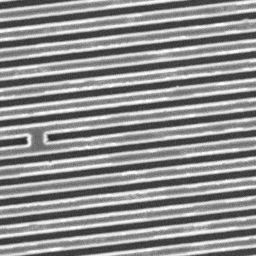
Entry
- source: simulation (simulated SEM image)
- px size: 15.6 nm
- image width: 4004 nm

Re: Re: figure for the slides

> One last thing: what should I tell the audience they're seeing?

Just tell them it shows parallel lines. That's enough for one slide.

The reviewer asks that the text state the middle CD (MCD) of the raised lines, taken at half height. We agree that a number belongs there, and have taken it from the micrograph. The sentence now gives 163 nanometers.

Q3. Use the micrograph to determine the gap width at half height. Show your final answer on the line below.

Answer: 0.134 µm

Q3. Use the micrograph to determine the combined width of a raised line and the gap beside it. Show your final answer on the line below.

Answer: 19.5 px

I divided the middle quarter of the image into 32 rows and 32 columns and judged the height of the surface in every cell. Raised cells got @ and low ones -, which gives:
@@@@@@@@@@@@@-------------------
@@@@@---------------------@@@@@@
------------------@@@@@@@@@@@@@@
---------@@@@@@@@@@@@@@@@@@@@@--
-@@@@@@@@@@@@@@@@@@@@@----------
@@@@@@@@@@@@--------------------
@@@---------------------@@@@@@@@
----------------@@@@@@@@@@@@@@@@
-------@@@@@@@@@@@@@@@@@@@@@----
@@@@@@@@@@@@@@@@@@@@------------
@@@@@@@@@@@---------------------
@@@----------------------@@@@@@@
----------------@@@@@@@@@@@@@@@@
------@-@@@@@@@@@@@@@@@@@@@@----
@@@@@@@@@@@@@@@@@@@@------------
@@@@@@@@@@@--------------------@
@@@--------------------@@@@@@@@@
--------------@@@@@@@@@@@@@@@@@@
-------@@@@@@@@@@@@@@@@@@@@-----
@@@@@@@@@@@@@@@@@@--------------
@@@@@@@@@@---------------------@
@----------------------@@@@@@@@@
--------------@@@@@@@@@@@@@@@@@@
------@@@@@@@@@@@@@@@@@@@@@-----
@@@@@@@@@@@@@@@@@@--------------
@@@@@@@@@@--------------------@@
@---------------------@@@@@@@@@@
--------------@@@@@@@@@@@@@@@@@@
------@@@@@@@@@@@@@@@@@@@@@-----
@@@@@@@@@@@@@@@@@@--------------
@@@@@@@@@@-------------------@@@
@--------------------@@@@@@@@@@@